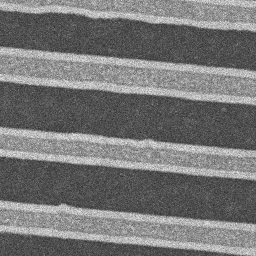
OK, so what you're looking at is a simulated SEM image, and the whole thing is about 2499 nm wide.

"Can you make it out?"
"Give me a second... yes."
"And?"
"one or a few lines or trenches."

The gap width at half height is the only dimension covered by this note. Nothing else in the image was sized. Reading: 506 nm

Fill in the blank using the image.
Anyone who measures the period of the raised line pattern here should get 737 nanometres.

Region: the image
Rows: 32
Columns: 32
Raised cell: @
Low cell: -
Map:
@@@@@@@@@@@@@@@@@@@@@@@@@@@@@@@-
-----------@@@@@@@@@@@@@@@@@@@@@
---------------------@@@@@@@@@@@
--------------------------------
--------------------------------
--------------------------------
@@------------------------------
@@@@@@@@@@@@@-------------------
@@@@@@@@@@@@@@@@@@@@@@@---------
@@@@@@@@@@@@@@@@@@@@@@@@@@@@@@@@
--------@@@@@@@@@@@@@@@@@@@@@@@@
--------------------@@@@@@@@@@@@
------------------------------@@
--------------------------------
--------------------------------
--------------------------------
@-------------------------------
@@@@@@@@@@@@@-------------------
@@@@@@@@@@@@@@@@@@@@@@@---------
----@@@@@@@@@@@@@@@@@@@@@@@@@@@@
----------------@@@@@@@@@@@@@@@@
-------------------------@@@@@@@
--------------------------------
--------------------------------
--------------------------------
--------------------------------
@@@@@@@@@@----------------------
@@@@@@@@@@@@@@@@@@@@@-----------
@@@@@@@@@@@@@@@@@@@@@@@@@@@@@@@-
-----------@@@@@@@@@@@@@@@@@@@@@
----------------------@@@@@@@@@@
-------------------------------@